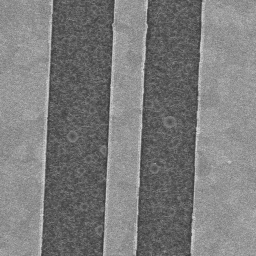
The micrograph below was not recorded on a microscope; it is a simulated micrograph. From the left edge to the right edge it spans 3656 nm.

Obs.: one or a few lines or trenches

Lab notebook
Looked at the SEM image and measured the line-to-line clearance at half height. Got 813 nanometres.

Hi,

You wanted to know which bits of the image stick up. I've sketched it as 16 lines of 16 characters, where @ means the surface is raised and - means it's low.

@@@----@@----@@@
@@@----@@----@@@
@@@----@@----@@@
@@@----@@----@@@
@@@----@@---@@@@
@@@----@@---@@@@
@@@----@@---@@@@
@@@----@@---@@@@
@@@----@@---@@@@
@@@----@@---@@@@
@@@----@@---@@@@
@@@----@@---@@@@
@@@----@@---@@@@
@@@----@@---@@@@
@@@---@@@---@@@@
@@@----@----@@@@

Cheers